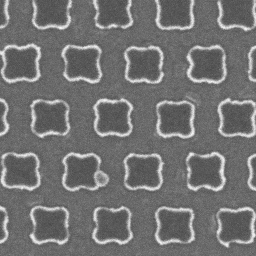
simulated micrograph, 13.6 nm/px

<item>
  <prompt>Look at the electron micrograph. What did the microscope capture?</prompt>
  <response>a regular array of raised bodies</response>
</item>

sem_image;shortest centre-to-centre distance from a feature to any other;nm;826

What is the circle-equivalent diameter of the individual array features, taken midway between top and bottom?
40.3 pixels